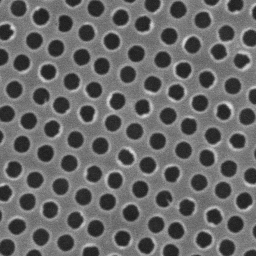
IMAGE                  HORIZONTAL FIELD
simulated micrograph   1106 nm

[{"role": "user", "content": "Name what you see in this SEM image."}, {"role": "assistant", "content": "a regular array of holes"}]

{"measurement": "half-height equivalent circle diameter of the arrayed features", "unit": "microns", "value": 0.0725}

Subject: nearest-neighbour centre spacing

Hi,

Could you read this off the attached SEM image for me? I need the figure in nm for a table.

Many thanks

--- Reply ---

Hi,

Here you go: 103